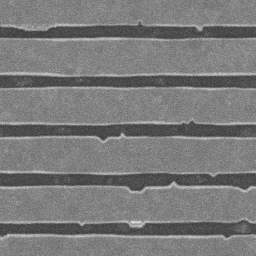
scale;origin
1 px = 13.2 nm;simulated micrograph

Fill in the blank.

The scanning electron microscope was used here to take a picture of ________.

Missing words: parallel lines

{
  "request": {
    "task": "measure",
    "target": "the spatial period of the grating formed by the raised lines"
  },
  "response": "0.651 microns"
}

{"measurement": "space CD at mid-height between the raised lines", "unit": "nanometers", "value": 179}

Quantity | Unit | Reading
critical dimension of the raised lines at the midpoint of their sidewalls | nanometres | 475